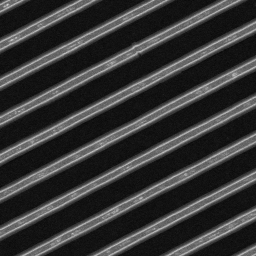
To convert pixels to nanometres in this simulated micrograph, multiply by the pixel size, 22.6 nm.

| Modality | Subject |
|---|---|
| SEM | parallel lines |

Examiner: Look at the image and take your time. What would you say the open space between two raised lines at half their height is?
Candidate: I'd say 516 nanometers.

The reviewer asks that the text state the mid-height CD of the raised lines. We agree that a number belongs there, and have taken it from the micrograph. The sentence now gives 238 nm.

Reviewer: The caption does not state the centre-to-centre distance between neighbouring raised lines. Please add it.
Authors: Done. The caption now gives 33.3 pixels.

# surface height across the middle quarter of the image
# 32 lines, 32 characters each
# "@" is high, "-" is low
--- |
--------@@@@@-------------@@@@@-
------@@@@@-------------@@@@@---
----@@@@@-------------@@@@@-----
--@@@@@-------------@@@@@-------
@@@@@-------------@@@@@---------
@@@-------------@@@@@@----------
@@-------------@@@@@------------
-------------@@@@@------------@@
-----------@@@@@------------@@@@
---------@@@@@------------@@@@@@
-------@@@@@-------------@@@@@--
-----@@@@@-------------@@@@@----
---@@@@@-------------@@@@@------
-@@@@@-------------@@@@@--------
@@@@-------------@@@@@----------
@@-------------@@@@@------------
-------------@@@@@-------------@
-----------@@@@@@------------@@@
---------@@@@@@------------@@@@@
-------@@@@@@------------@@@@@@-
-----@@@@@@------------@@@@@@---
---@@@@@@------------@@@@@@-----
-@@@@@@------------@@@@@@-------
@@@@@-------------@@@@@---------
@@@-------------@@@@@-----------
@-------------@@@@@-------------
------------@@@@@-------------@@
----------@@@@@-------------@@@@
--------@@@@@-------------@@@@@-
------@@@@@-------------@@@@@@--
-----@@@@@------------@@@@@@----
---@@@@-------------@@@@@@------